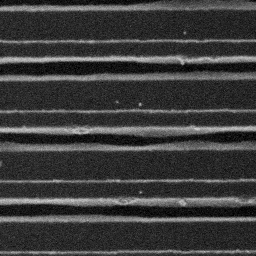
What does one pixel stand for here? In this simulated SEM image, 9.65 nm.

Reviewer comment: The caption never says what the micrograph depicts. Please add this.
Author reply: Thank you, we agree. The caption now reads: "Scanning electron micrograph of lines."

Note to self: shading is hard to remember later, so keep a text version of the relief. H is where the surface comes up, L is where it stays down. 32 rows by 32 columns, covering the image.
LLLLLLLLLLLLLLLLLLLLLLLLLLLLLLLL
HHHHHHHHHHHHHHHHHHHHHHHHHHHHHHHH
HHHHHHHHHHHHHHHHHHHHHHHHHHHHHHHH
HHHHHHHHHHHHHHHHHHHHHHHHHHHHHHHH
HHHHHHHHHHHHHHHHHHHHHHHHHHHHHHHH
HHHHHHHHHHHHHHHHHHHHHHHHHHHHHHHH
HHHHHHHHHHHHHHHHHHHHHHHHHHHHHHHH
LLLLLLLLLLLLLLLLLLLLLLHHHLHHLLLL
LLLLLLLLLLLLLLLLLLLLLLLLLLLLLLLL
LLLLLLLLLLLLLLLLLLLLLLLLLLLLLLLL
HHHHHHHHHHHHHHHHHHHHHHHHHHHHHHHH
HHHHHHHHHHHHHHHHHHHHHHHHHHHHHHHH
HHHHHHHHHHHHHHHHHHHHHHHHHHHHHHHH
HHHHHHHHHHHHHHHHHHHHHHHHHHHHHHHH
HHHHHHHHHHHHHHHHHHHHHHHHHHHHHHHH
HHHHHHHHHHHHHHHHHHHHHHHHHHHHHHHH
LLLLLLLLLHHLLLLLLLLLLLLLLLLLLLLL
LLLLLLLLLLLLLLLLLLLLLLLLLLLLLLLL
LLLLLLLLLLLLLLLLLLLLLHHHHHHHHHHH
HHHHHHHHHHHHHHHHHHHHHHHHHHHHHHHH
HHHHHHHHHHHHHHHHHHHHHHHHHHHHHHHH
HHHHHHHHHHHHHHHHHHHHHHHHHHHHHHHH
HHHHHHHHHHHHHHHHHHHHHHHHHHHHHHHH
HHHHHHHHHHHHHHHHHHHHHHHHHHHHHHHH
HHHHHHHHHHHHHHHHHHHHHHHHHHHHHHHH
LLLLLLLLLLLLLLLHLLLLLLLLLLLLLLLL
LLLLLLLLLLLLLLLLLLLLLLLLLLLLLLLL
LLLLLLLLLLHHHLHLLLLLLLLLLLLLLHHH
HHHHHHHHHHHHHHHHHHHHHHHHHHHHHHHH
HHHHHHHHHHHHHHHHHHHHHHHHHHHHHHHH
HHHHHHHHHHHHHHHHHHHHHHHHHHHHHHHH
HHHHHHHHHHHHHHHHHHHHHHHHHHHHHHHH